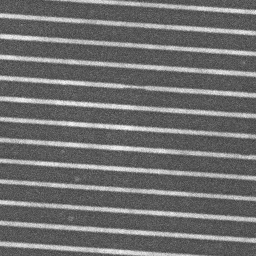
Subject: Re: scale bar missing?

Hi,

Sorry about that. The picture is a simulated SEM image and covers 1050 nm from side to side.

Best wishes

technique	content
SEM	parallel lines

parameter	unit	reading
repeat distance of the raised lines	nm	84.8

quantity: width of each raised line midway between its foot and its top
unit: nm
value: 12.3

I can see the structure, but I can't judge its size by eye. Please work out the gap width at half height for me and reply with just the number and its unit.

71.5 nanometers